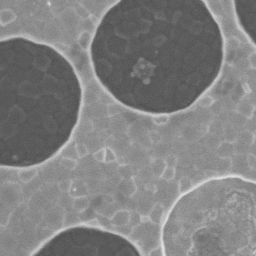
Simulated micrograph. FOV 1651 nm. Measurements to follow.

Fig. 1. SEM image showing holes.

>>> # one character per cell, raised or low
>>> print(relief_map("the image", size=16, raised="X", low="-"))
XXXXXXX------XX-
XXXXXX--------X-
--XXXX--------XX
----XX--------XX
-----X--------XX
-----XX------XXX
-----XXX----XXXX
-----XXXXXXXXXXX
----XXXXXXXXXXXX
----XXXXXXXXXXXX
XXXXXXXXXXXXXXXX
XXXXXXXXXXXXXXXX
XXXXXXXXXXXXXXXX
XXXXXXXXXXXXXXXX
XXXX---XXXXXXXXX
XXX-----XXXXXXXX